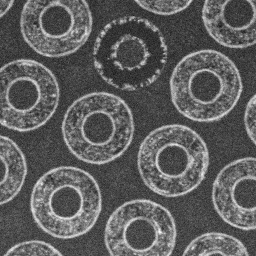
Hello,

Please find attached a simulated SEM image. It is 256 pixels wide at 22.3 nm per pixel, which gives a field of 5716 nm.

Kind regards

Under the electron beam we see ring-shaped raised bodies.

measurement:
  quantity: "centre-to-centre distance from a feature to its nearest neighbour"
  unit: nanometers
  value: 1800